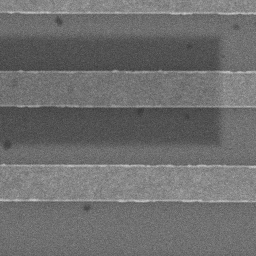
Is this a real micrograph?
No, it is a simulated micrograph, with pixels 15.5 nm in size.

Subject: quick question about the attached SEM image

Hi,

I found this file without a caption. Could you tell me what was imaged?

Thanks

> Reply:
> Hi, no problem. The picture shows lines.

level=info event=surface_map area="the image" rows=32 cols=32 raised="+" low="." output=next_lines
++++++++++++++++++++++++++++++++
.+++++++++++++++++++++++++++++++
................................
................................
................................
................................
................................
................................
................................
++++++++++++++++++++++++++++++++
++++++++++++++++++++++++++++++++
++++++++++++++++++++++++++++++++
++++++++++++++++++++++++++++++++
................................
................................
................................
................................
................................
................................
................................
................................
++++++++++++++++++++++++++++++++
++++++++++++++++++++++++++++++++
++++++++++++++++++++++++++++++++
++++++++++++++++++++++++++++++++
................................
................................
................................
................................
................................
................................
................................